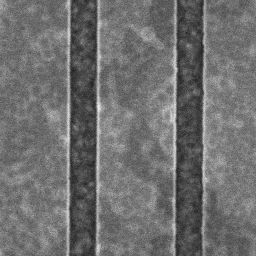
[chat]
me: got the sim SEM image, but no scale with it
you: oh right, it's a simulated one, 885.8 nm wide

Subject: one or a few lines or trenches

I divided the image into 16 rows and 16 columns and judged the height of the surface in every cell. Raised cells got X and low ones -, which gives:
XXXX--XXXXX--XXX
XXXX--XXXXX--XXX
XXXX--XXXXX--XXX
XXXX--XXXXX--XXX
XXXX--XXXXX--XXX
XXXX--XXXXX--XXX
XXXX--XXXXX--XXX
XXXX--XXXXX--XXX
XXXX--XXXXX--XXX
XXXX--XXXXX--XXX
XXXX--XXXXX--XXX
XXXX--XXXXX--XXX
XXXX--XXXXX--XXX
XXXX--XXXXX--XXX
XXXX--XXXXX--XXX
XXXX--XXXXX--XXX